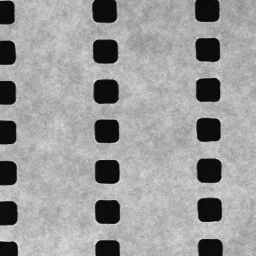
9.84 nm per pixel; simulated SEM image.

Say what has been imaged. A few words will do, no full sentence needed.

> a regular array of holes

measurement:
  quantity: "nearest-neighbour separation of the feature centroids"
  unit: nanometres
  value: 394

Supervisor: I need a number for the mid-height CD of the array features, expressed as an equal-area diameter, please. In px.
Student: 26.3